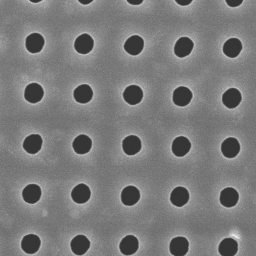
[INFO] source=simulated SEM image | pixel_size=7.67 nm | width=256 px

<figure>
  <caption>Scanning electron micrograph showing a regular array of holes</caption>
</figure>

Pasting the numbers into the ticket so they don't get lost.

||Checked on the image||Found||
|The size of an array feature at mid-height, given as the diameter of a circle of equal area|0.153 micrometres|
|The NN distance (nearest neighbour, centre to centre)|49.3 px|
